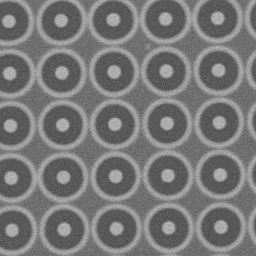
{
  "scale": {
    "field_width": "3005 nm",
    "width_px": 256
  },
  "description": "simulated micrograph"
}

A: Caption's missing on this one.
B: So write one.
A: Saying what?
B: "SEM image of an array of small figures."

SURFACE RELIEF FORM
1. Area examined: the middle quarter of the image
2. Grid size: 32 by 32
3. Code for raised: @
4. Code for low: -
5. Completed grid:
----@@@-----@-----@@-----@-----@
@----@@----@@@----@@----@@@----@
@----@@----@@@----@@----@@@----@
-----@@-----@-----@@-----------@
----@@@@---------@@@@---------@@
----@@@@---------@@@@@--------@@
---@@@@@@------@@@@@@@@-----@@@@
-@@@@@@@@@@@-@@@@@@@@@@@@@@@@@@@
@@@@@@@@@@@@@@@@@@@@@@@@@@@@@@@@
@@@@@@@@@@@@@@@@@@@@@@@@---@@@@@
--@@@@@@@@------@@@@@@-------@@@
----@@@@@--------@@@@@--------@@
-----@@@----------@@@----------@
-----@@-----------@@@----@@----@
@----@@----@@@----@@----@@@----@
@----@@----@@@----@@----@@@----@
@----@@@----@-----@@@----------@
-----@@@----------@@@----------@
----@@@@---------@@@@@--------@@
---@@@@@@-------@@@@@@@------@@@
-@@@@@@@@@@@--@@@@@@@@@@@@@@@@@@
@@@@@@@@@@@@@@@@@@@@@@@@@@@@@@@@
@@@@@@@@@@@@@@@@@@@@@@@@@--@@@@@
--@@@@@@@@------@@@@@@@------@@@
----@@@@@--------@@@@@--------@@
-----@@@----------@@@----------@
-----@@@----------@@@----@@----@
@----@@----@@@----@@----@@@----@
@----@@-----@@----@@----@@@----@
@----@@@----@@----@@@----------@
-----@@@----------@@@----------@
----@@@@@--------@@@@@--------@@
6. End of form